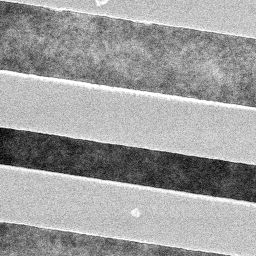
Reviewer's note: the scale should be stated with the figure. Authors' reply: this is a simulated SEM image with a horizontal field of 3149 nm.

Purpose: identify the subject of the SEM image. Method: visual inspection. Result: lines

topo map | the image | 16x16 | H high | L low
LLLHHHHHHHHHHHHH
LLLLLLLLLLHHHHHH
LLLLLLLLLLLLLLLL
LLLLLLLLLLLLLLLL
HLLLLLLLLLLLLLLL
HHHHHHHLLLLLLLLL
HHHHHHHHHHHHHHLL
HHHHHHHHHHHHHHHH
LLLLHHHHHHHHHHHH
LLLLLLLLLLLHHHHH
HLLLLLLLLLLLLLLL
HHHHHHHHLLLLLLLL
HHHHHHHHHHHHHHHL
HHHHHHHHHHHHHHHH
LLLLLHHHHHHHHHHH
LLLLLLLLLLLHHHHH